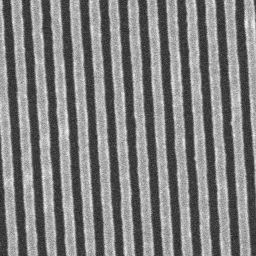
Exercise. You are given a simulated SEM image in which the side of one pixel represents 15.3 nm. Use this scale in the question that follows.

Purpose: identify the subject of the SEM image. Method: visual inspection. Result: parallel lines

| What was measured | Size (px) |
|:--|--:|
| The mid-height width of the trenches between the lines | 9.73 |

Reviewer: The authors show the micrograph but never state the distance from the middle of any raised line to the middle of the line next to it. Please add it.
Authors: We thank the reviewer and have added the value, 296 nm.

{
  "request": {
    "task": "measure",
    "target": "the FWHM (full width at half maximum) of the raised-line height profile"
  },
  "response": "0.147 micrometres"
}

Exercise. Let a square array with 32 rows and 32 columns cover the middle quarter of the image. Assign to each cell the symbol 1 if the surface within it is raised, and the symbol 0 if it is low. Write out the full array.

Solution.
00011000110011000110001100011000
00011001110011000110001100011000
00011000110011100110001100011000
00011000110011100110001100011000
00011000110011100110001100011000
00011000110001100110001100011000
00011000110001100111001100011000
00011000110001100011001110011000
00011000110001100011001110011000
00011000110001100011001110011100
10011000110001100011000110011100
10011000110001100011000110011100
10011100110001100011000110001100
10001100110001100011000110001100
10001100110001100011000110001100
10001100111001100011000110001100
10001100111001100011000110001100
10001100111001110011000110001100
10001100011001110011000110001100
10001100011001110011000110001100
10001100011001110011100110001100
10001100011000110011100110001100
10001100011000110011100110001100
10001100011000110001100111001100
10001100011000110001100111000100
10001100011000110001100011001110
10001100011000110001100011001110
11001100011000110001100011001110
11001110011000110001100011000110
11001110011000110001100011000110
11001110011100110001100011000110
11000110011100110001100011000110